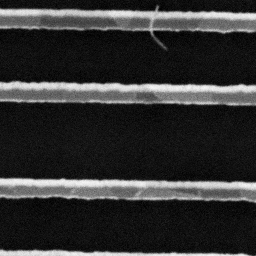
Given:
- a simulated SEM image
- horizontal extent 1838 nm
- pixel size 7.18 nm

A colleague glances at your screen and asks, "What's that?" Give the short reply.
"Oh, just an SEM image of lines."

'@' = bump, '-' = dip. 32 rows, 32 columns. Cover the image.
--------------------------------
@@@@@@@@@@----------------------
@@@@@@@@@@@@@@@@@@@@@@@@@@@@@@@@
------@@@@@@@@@@@@@@@@@@@@@@@@@@
--------------------------------
--------------------------------
--------------------------------
--------------------------------
--------------------------------
--------------------------------
-@@--@--------------------------
@@@@@@@@@@@@@@@@@@@@@@@@@@@@@@@@
@@@@@@@@@@@@@@@@@@@@@@@@@@@@@@@@
--------------------------------
--------------------------------
--------------------------------
--------------------------------
--------------------------------
--------------------------------
--------------------------------
--------------------------------
--------------------------------
--------------------------------
@@@@@@@@@@@@@@@@@@@@@@@@@@@@@@@@
@@@@@@@@@@@@@@@@@@@@@@@@@@@@@@@@
--------------------------------
--------------------------------
--------------------------------
--------------------------------
--------------------------------
--------------------------------
--------------------------------